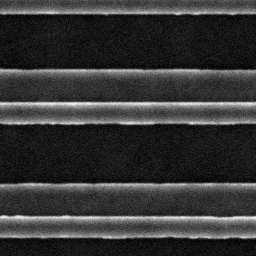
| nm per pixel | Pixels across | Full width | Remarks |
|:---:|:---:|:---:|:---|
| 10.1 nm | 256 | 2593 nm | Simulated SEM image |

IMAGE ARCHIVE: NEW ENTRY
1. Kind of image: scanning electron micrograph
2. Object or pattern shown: lines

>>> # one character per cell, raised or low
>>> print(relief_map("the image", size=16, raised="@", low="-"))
@@@@@@@@@@@@@@@@
----------------
----------------
----------------
@@@@@@@@@@@@@@@@
@@@@@@@@@@@@@@@@
@@@@@@@@@@@@@@@@
@@@@@@@@@@@@@@@@
----------------
----------------
----------------
----------------
@@@@@@@@@@@@@@@@
@@@@@@@@@@@@@@@@
@@@@@@@@@@@@@@@@
----------------